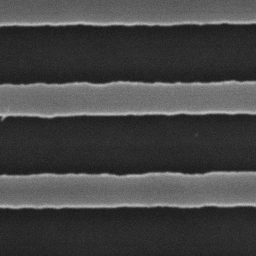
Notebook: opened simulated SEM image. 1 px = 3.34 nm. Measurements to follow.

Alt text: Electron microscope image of lines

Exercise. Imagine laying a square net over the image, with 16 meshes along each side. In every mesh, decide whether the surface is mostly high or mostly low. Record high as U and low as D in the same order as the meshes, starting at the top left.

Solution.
UUUUUUUUUUUUUUUU
UUUUUUUUUUUUUDDD
DDDDDDDDDDDDDDDD
DDDDDDDDDDDDDDDD
DDDDDDDDDDDDDDDD
UUUUUUUUUUUUUUUU
UUUUUUUUUUUUUUUU
DDDDDDDDDDDDDDDD
DDDDDDDDDDDDDDDD
DDDDDDDDDDDDDDDD
DDDDDDDDDDDDDDDD
UUUUUUUUUUUUUUUU
UUUUUUUUUUUUUUUU
DDDDDDDDDDDDDDDD
DDDDDDDDDDDDDDDD
DDDDDDDDDDDDDDDD